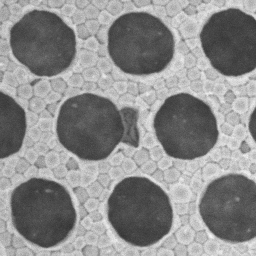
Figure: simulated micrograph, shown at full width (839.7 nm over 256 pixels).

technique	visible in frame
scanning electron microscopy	holes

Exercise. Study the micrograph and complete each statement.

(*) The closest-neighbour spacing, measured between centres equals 95.1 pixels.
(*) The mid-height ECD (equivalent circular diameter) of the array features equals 216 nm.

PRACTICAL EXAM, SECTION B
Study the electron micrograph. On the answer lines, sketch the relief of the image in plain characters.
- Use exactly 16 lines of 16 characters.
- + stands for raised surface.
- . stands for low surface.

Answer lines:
++++++++++++++++
+...+++...+++...
+....++....++...
+....++....++...
++..++++..++++..
++++++++++++++++
.+++...+++...+++
..++.....+...+++
..++.....+....++
.+++...+++...+++
++++++++++++++++
+...+++...+++...
+...+++....++...
+....++....++...
+...+++...+++...
++++++++++++++++